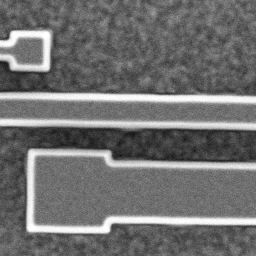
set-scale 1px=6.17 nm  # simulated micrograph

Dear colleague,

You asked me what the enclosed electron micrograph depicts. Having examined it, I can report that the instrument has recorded groups of lines, slits or small figures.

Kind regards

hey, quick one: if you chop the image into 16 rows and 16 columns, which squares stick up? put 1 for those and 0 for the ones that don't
0000000000000000
0000000000000000
0110000000000000
1110000000000000
0000000000000000
0000000000000000
1111111111111111
1111111111111111
0000000000000000
0011100000000000
0011111111111111
0011111111111111
0011111111111111
0011111111111111
0000000000000000
0000000000000000